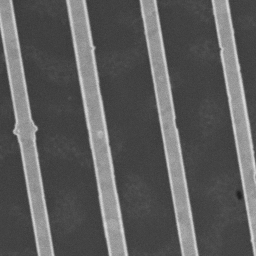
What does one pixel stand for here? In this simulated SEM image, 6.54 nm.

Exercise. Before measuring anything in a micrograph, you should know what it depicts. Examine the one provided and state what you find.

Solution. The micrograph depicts one or a few lines or trenches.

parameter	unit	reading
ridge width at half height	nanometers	95.2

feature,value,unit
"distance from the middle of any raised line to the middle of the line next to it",0.465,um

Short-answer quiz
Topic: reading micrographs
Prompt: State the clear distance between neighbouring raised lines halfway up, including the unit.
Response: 0.365 micrometres